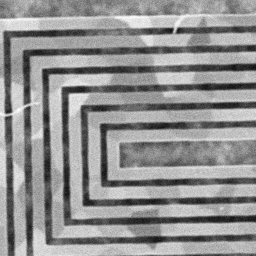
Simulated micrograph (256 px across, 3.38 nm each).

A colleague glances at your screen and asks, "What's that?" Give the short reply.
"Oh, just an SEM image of groups of lines, slits or small figures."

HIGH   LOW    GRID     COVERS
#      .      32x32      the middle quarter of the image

#######.........................
................................
..................##############
################################
################################
................................
................................
.....###########################
.###############################
.###############################
.###............................
.###............................
.###..##########################
.###..##########################
.###..############..............
.###..###.......................
.###..###................#######
.###..###..#####################
.###..###..#####################
.###..###..###..................
..##..###..###..................
..##..###..###..................
..##..###..###..................
..##..###..###..................
..##..###..###..................
..##..###..###..................
..##..###..#####################
..##..###..#####################
..##...##..##################...
..##...##.......................
..##..###.......................
..##..##########################